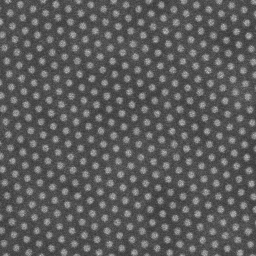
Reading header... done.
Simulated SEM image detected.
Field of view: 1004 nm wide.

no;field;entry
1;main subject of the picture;a regular array of raised bodies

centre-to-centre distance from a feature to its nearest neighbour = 13.1 pixels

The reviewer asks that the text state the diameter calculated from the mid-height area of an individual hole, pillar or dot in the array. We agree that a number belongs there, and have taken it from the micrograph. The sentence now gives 6.58 pixels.